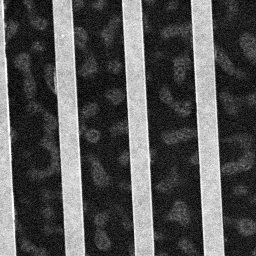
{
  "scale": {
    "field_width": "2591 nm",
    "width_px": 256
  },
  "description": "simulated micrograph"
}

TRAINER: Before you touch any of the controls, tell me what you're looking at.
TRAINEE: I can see one or a few lines or trenches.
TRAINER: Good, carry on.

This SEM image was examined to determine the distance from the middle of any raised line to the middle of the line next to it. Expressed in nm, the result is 703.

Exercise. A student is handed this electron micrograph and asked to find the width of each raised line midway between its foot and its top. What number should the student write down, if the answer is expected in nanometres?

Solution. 181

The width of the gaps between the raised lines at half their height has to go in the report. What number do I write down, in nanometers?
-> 514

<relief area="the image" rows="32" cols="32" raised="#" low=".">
.......##......###......##......
.......##......###......##......
.......##......###......##......
.......##.......##......###.....
.......##.......##......###.....
#......##.......##......###.....
#......##.......##......###.....
#......##.......##......###.....
#......##.......##......###.....
#......##.......##....#.###.....
#......##.......##......###.....
#......##.......##..#....##.....
#......##.......##..#....##.....
#......###......##.......##.....
#......###......##.......##.....
#......###......##.......##.....
#......#####....##.......##.....
#.......##.#....###......##.....
#.......##......###......##.....
#.......##......###......##.....
#.......##......###......##.....
#.......##......###......####...
#.......##.......##......###....
#.......##.......##......###....
##......##.......##......###....
##......##.......##......###....
##......##.......##......###....
##......##.......##......###....
##......##.......##......###....
##......##..#....##......###....
##......###.#....##.......##....
##......###......##.......##....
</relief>